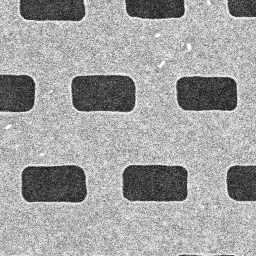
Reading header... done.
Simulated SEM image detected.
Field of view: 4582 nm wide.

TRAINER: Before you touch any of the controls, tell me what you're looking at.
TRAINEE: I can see holes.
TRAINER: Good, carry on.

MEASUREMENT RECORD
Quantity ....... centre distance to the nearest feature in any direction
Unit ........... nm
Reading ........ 1830